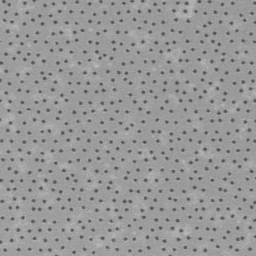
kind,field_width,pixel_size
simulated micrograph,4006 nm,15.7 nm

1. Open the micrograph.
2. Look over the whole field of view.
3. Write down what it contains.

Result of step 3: a regular array of holes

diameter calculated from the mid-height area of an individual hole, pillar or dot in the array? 3.74 pixels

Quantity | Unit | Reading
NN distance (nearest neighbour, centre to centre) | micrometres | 0.137